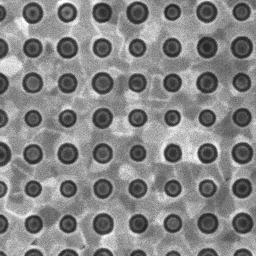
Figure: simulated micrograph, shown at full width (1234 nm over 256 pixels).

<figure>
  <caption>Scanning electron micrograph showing a regular array of ring-shaped grooves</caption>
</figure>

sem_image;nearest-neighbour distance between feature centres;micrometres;0.166